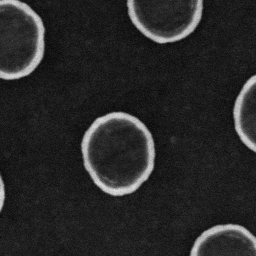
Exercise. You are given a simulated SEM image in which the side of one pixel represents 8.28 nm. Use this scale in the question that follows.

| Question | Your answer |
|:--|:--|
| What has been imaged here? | raised bodies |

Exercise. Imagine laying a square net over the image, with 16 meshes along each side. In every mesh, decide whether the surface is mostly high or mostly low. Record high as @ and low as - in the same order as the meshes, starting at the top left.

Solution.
@@------@@@@----
@@-------@@@----
@@@-------@-----
@@--------------
@@--------------
---------------@
---------------@
------@@-------@
-----@@@@------@
-----@@@@-------
------@@@-------
------@@@-------
----------------
----------------
-------------@@-
------------@@@@